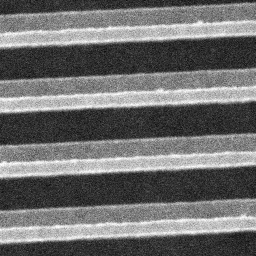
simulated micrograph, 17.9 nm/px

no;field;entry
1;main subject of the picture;lines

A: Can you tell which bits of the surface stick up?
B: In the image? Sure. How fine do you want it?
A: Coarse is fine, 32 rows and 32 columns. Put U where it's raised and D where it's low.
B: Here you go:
DDDDDDDDDDDDDDDDDDDDDDDDDDDDDDUU
DDDDDDDDDDDUUUUUUUUUUUUUUUUUUUUU
UUUUUUUUUUUUUUUUUUUUUUUUUUUUUUUU
UUUUUUUUUUUUUUUUUUUUUUUUUUUUUUUU
UUUUUUUUUUUUUUUUUUUUUUUUUUUUDDDD
UUUUUUDDDDDDDDDDDDDDDDDDDDDDDDDD
DDDDDDDDDDDDDDDDDDDDDDDDDDDDDDDD
DDDDDDDDDDDDDDDDDDDDDDDDDDDDDDDD
DDDDDDDDDDDDDDDDDDDDDDDDDDDDDDDD
DDDDDDDDDDDDDDUUUUUUUUUUUUUUUUUU
UUUUUUUUUUUUUUUUUUUUUUUUUUUUUUUU
UUUUUUUUUUUUUUUUUUUUUUUUUUUUUUUU
UUUUUUUUUUUUUUUUUUUUUUUUUUUUUUUD
UUUUUUUUUDDDDDDDDDDDDDDDDDDDDDDD
DDDDDDDDDDDDDDDDDDDDDDDDDDDDDDDD
DDDDDDDDDDDDDDDDDDDDDDDDDDDDDDDD
DDDDDDDDDDDDDDDDDDDDDDDDDDDDDDDD
DDDDDDDDDDDDDDDDDUUUUUUUUUUUUUUU
UUUUUUUUUUUUUUUUUUUUUUUUUUUUUUUU
UUUUUUUUUUUUUUUUUUUUUUUUUUUUUUUU
UUUUUUUUUUUUUUUUUUUUUUUUUUUUUUUU
UUUUUUUUUUUUUDDDDDDDDDDDDDDDDDDD
DDDDDDDDDDDDDDDDDDDDDDDDDDDDDDDD
DDDDDDDDDDDDDDDDDDDDDDDDDDDDDDDD
DDDDDDDDDDDDDDDDDDDDDDDDDDDDDDDD
DDDDDDDDDDDDDDDDDDUUUUUUUUUUUUUU
UUUUUUUUUUUUUUUUUUUUUUUUUUUUUUUU
UUUUUUUUUUUUUUUUUUUUUUUUUUUUUUUU
UUUUUUUUUUUUUUUUUUUUUUUUUUUUUUUU
UUUUUUUUUUUUUUUUDDDDDDDDDDDDDDDD
DDDDDDDDDDDDDDDDDDDDDDDDDDDDDDDD
DDDDDDDDDDDDDDDDDDDDDDDDDDDDDDDD